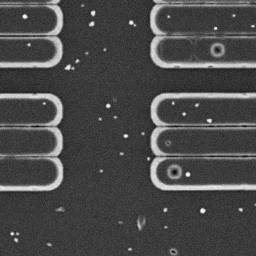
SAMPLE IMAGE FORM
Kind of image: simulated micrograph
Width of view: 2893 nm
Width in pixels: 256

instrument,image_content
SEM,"wiring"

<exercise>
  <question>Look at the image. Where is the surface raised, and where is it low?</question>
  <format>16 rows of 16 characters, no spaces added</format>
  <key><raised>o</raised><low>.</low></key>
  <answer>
oooo......oooooo
oooo......oooooo
oooo......oooooo
oooo......oooooo
................
................
oooo......oooooo
oooo......oooooo
oooo......oooooo
oooo......oooooo
oooo......oooooo
ooo.......oooooo
................
................
................
................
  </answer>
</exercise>